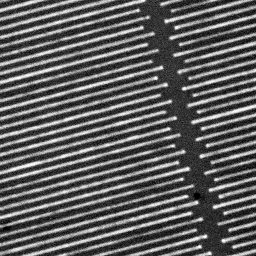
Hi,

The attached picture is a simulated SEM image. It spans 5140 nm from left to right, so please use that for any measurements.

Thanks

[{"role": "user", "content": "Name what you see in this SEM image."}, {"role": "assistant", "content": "parallel lines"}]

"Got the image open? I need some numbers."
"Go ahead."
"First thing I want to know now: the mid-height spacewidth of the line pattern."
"131 nanometres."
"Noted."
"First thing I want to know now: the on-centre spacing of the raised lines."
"175 nanometres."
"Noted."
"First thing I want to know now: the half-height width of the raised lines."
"34 nm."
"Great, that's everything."